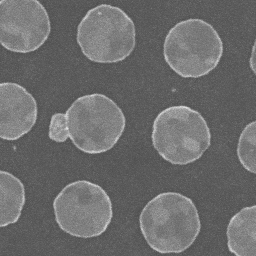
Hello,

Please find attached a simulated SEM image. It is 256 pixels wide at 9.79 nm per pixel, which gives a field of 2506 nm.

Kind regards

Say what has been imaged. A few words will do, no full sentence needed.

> raised bodies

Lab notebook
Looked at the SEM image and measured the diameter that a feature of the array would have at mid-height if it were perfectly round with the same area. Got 0.563 microns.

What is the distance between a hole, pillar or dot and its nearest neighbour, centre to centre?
87.4 px